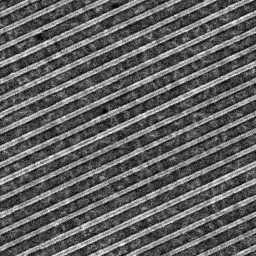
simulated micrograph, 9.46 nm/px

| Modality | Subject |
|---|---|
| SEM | parallel lines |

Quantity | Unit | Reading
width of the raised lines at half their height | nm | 35.4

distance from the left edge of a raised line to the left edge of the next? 144 nanometers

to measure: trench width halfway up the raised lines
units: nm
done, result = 107